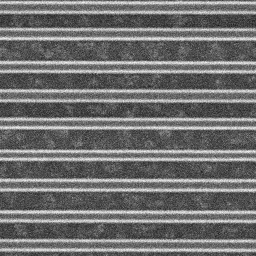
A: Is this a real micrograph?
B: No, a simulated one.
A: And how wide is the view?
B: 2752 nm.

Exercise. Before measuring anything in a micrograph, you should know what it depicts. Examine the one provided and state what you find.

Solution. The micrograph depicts parallel lines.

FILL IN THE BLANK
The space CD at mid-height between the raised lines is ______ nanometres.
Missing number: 207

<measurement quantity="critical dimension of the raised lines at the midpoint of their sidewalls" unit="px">10.3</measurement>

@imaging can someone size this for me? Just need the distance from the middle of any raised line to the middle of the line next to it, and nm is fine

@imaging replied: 320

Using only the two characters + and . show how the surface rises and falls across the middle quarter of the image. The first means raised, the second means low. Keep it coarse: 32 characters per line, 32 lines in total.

++++++++++++++++++++++++++++++++
++++++++++++++++++++++++++++++++
................................
................................
................................
................................
................................
++++++++++++++++++++++++++++++++
++++++++++++++++++++++++++++++++
................................
................................
................................
................................
................................
++++++++++++++++++++++++++++++++
++++++++++++++++++++++++++++++++
................................
................................
................................
................................
................................
................................
++++++++++++++++++++++++++++++++
++++++++++++++++++++++++++++++++
................................
................................
................................
................................
................................
++++++++++++++++++++++++++++++++
++++++++++++++++++++++++++++++++
.............+++++++++++++++++++